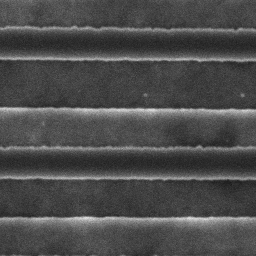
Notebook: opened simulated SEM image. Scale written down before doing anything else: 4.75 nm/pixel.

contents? lines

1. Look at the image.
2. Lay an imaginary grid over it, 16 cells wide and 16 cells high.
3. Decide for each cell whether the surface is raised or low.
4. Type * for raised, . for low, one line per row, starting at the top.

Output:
****************
****************
****************
****************
................
................
................
****************
****************
****************
****************
................
................
................
****************
****************